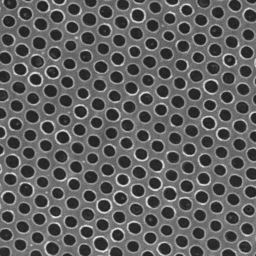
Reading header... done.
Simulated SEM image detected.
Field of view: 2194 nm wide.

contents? a regular array of holes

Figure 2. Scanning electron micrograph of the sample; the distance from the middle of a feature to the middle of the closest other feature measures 18 pixels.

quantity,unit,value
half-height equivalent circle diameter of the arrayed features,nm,105